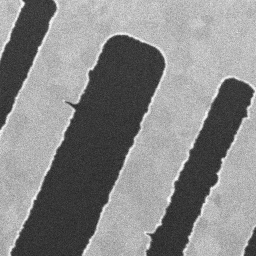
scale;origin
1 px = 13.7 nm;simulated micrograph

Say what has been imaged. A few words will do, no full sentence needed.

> one or a few lines or trenches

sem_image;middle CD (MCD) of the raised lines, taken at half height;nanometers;760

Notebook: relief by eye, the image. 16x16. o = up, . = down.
o...oooooooooooo
o..ooooooooooooo
...oooo..ooooooo
..oooo....oooooo
..oooo....oooooo
.oooo.....oooo..
.oooo....oooo...
oooo.....oooo..o
oooo.....ooo...o
ooo.....oooo..oo
ooo.....ooo...oo
ooo....oooo..ooo
oo.....oooo..ooo
oo....oooo..oooo
o.....oooo..oooo
o....oooo...ooo.